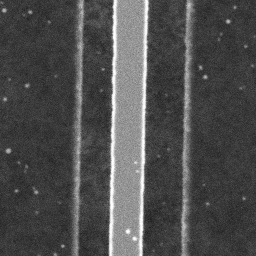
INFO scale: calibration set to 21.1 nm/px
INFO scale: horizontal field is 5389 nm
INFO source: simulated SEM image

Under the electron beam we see lines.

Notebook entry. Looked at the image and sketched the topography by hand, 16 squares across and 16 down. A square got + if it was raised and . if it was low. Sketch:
+++++..++...++++
+++++..++...++++
+++++..++...++++
+++++..++...++++
+++++..++...++++
+++++..++...++++
+++++..++...++++
+++++..++...++++
+++++..++...++++
+++++..++...++++
+++++..++...++++
+++++..++...++++
+++++..++...++++
+++++..++...++++
+++++..++..+++++
+++++..++..+++++